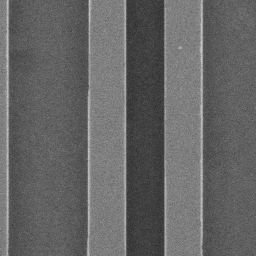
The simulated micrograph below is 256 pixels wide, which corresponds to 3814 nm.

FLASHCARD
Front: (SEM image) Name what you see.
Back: lines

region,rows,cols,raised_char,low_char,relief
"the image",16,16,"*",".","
......**..***...
......**..***...
......**..***...
......**..***...
......**..***...
......**..***...
......**..***...
......**..***...
......**..***...
......**..***...
......**..***...
......**..***...
......**..***...
......**..***...
......**..***...
.....***..***...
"